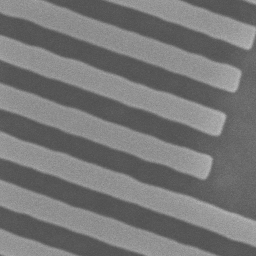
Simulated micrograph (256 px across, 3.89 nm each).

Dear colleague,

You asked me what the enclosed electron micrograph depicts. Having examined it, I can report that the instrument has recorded groups of lines, slits or small figures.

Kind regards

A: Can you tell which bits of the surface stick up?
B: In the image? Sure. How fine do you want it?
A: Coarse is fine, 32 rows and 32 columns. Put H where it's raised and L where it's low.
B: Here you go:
HHHHHHLLLLLLLLLHHHHHHHHLLLLLLLLL
HHHHHHHHHLLLLLLLLLHHHHHHHHLLLLLL
LLLLHHHHHHHHLLLLLLLLLHHHHHHHHLLL
LLLLLLHHHHHHHHHLLLLLLLLLHHHHHHHH
LLLLLLLLLHHHHHHHHHLLLLLLLLHHHHHH
HHHLLLLLLLLLHHHHHHHHHLLLLLLLLHHL
HHHHHHLLLLLLLLHHHHHHHHHLLLLLLLLL
HHHHHHHHHLLLLLLLLLHHHHHHHHLLLLLL
LLLHHHHHHHHHLLLLLLLLHHHHHHHHHLLL
LLLLLLHHHHHHHHHLLLLLLLLHHHHHHHLL
LLLLLLLLLHHHHHHHHLLLLLLLLLHHHHLL
HHHLLLLLLLLLHHHHHHHHHLLLLLLLLLLL
HHHHHHLLLLLLLLHHHHHHHHHLLLLLLLLL
HHHHHHHHHLLLLLLLLHHHHHHHHHLLLLLL
LLLHHHHHHHHHLLLLLLLLHHHHHHHHLLLL
LLLLLLHHHHHHHHLLLLLLLLLHHHHHLLLL
LLLLLLLLHHHHHHHHHLLLLLLLLLHLLLLL
HHHLLLLLLLLHHHHHHHHHLLLLLLLLLLLL
HHHHHHLLLLLLLLHHHHHHHHHLLLLLLLLL
HHHHHHHHHLLLLLLLLHHHHHHHHHLLLLLL
LLHHHHHHHHHLLLLLLLLLHHHHHHLLLLLL
LLLLLHHHHHHHHHLLLLLLLLLHHHLLLLLL
LLLLLLLLHHHHHHHHHLLLLLLLLLLLLLLL
HHHLLLLLLLLHHHHHHHHHLLLLLLLLLLLL
HHHHHHLLLLLLLLHHHHHHHHHLLLLLLLLL
HHHHHHHHLLLLLLLLLHHHHHHHHHLLLLLL
LLHHHHHHHHHLLLLLLLLLHHHHHHHHLLLL
LLLLLHHHHHHHHHLLLLLLLLLHHHHHHHHL
LLLLLLLLHHHHHHHHHLLLLLLLLLHHHHHH
HHLLLLLLLLLHHHHHHHHHLLLLLLLLHHHH
HHHHHLLLLLLLLLHHHHHHHHHLLLLLLLLH
HHHHHHHHLLLLLLLLLHHHHHHHHHLLLLLL